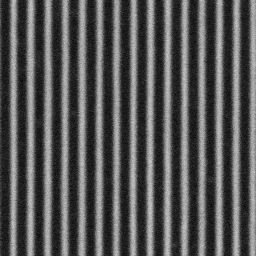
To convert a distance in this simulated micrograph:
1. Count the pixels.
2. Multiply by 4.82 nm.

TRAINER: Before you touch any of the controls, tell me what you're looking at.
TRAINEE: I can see parallel lines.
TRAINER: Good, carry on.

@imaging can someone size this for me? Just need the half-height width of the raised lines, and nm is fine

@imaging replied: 24.1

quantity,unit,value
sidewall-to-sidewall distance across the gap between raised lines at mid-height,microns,0.0572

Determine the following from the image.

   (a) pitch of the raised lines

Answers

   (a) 82.5 nm